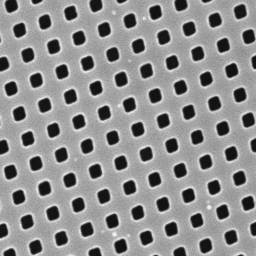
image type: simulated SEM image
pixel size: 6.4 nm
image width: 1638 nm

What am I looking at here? a regular array of holes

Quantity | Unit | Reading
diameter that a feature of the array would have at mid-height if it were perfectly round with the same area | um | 0.0902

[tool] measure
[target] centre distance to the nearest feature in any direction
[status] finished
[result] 168 nm